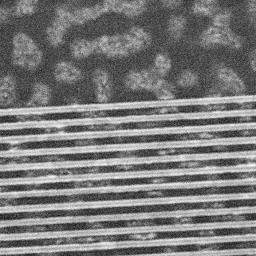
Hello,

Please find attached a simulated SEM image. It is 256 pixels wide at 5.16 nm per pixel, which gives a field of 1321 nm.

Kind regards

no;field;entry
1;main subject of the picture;parallel lines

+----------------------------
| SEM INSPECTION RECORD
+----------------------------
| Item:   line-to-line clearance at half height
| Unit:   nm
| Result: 44.5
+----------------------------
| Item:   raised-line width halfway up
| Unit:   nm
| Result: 28.4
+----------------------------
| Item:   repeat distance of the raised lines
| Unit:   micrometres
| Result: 0.0717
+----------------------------